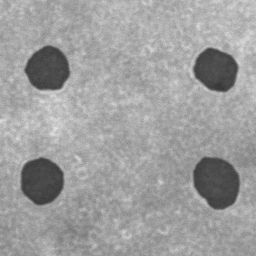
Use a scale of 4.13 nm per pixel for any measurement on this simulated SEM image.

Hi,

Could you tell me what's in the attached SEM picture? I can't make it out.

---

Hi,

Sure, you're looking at holes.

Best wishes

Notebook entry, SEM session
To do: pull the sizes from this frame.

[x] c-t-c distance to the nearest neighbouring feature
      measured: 463 nm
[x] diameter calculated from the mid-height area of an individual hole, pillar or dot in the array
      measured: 45.8 pixels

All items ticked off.